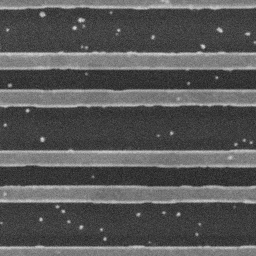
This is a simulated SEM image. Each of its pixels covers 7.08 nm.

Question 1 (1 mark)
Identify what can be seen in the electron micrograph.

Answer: lines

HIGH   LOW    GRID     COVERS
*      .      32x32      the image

********************************
................................
................................
................................
................................
................................
................................
********************************
*******..***********************
................................
................................
********************************
********************************
................................
................................
................................
................................
................................
................................
********************************
********************************
................................
................................
********************************
********************************
................................
................................
................................
................................
................................
................................
********************************